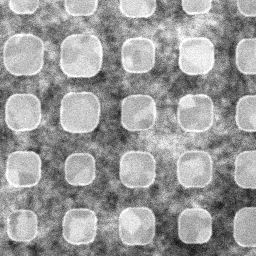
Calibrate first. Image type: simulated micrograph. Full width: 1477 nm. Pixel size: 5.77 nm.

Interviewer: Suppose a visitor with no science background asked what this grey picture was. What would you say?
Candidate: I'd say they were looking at a regular array of raised bodies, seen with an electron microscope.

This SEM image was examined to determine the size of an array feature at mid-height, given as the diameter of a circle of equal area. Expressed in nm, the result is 216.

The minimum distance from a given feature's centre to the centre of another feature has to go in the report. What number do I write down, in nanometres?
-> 328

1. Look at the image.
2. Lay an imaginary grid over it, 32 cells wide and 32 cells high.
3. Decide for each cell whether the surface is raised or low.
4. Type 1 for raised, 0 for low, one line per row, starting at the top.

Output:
01111000111100011110000111000011
00110000011100011110000111000011
00000000000000000000000000000000
00000000000000000000000000000000
00110000011100000000000000000000
01111000111110001110000111000011
01111000111110011110000111100011
01111000111110011110001111100011
01111000111110001110000111000011
00000000011100000000000000000000
00000000000000010000000000000000
00000000000000010000000000000000
01111000111100001110000111000011
01111000111100011110001111100011
01111000111100011110001111100011
01111000111100011110001111000011
00000000011000000000000000000000
00000000000000000000000000000000
00000000000000000000000000000000
01111000011000011110000111000011
01111000111100011110001111000111
01111000111100011110001111000111
01111000111100011110001111000111
00000000000000000000000000000000
00000000000000000000000000000000
00000000000000000000000011000000
00110000011000011110000111000011
01111000111100011110001111000111
11111000111100011110001111000111
01110000111100011110001111000111
00000000000000001100000000000011
00000000000000000000000000000000